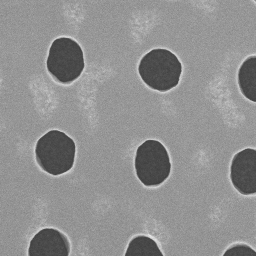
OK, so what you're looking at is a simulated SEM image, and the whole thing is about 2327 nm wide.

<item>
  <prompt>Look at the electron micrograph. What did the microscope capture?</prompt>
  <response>holes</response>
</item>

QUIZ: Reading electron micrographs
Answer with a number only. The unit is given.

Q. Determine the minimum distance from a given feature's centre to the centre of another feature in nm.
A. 848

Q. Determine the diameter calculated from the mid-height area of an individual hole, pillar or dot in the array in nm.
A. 372